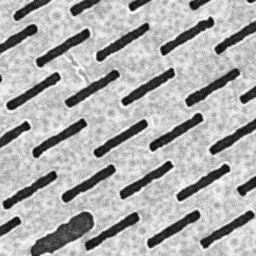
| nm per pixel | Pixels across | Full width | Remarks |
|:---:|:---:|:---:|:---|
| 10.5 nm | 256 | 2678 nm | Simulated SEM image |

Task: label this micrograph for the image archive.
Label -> a regular array of holes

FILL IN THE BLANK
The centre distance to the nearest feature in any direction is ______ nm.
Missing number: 554